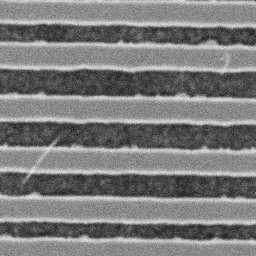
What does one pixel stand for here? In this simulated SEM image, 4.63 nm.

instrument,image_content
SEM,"lines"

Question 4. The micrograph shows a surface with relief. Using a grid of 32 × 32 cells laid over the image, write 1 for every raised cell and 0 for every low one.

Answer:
11111111111111111111111111111111
11111111111111111111111111111111
11111111111111111111111111111111
00000000000000000000000000000000
00000000000000000000000000000000
11111111111110000000000000000000
11111111111111111111111111111111
11111111111111111111111111111111
01111111110111111111111111111111
00000000000000000000000000000000
00000000000000000000000000000000
00000000000000000000000000000000
11111111111111111111111111111111
11111111111111111111111111111111
11111111111111111111111111111111
00000000000000000000000011111000
00000000000000000000000000000000
00000000000000000000000000000000
11111111100000000000000000000000
11111111111111111111111111111111
11111111111111111111111111111111
00111111111111111111111111111111
00000000000000000000000000000000
00000000000000000000000000000000
00000000000000000000000000000000
11111111111111111111111111111111
11111111111111111111111111111111
11111111111111111111111111111111
00000000000000000000000000000000
00000000000000000000000000000000
11111111111111111111111111111111
11111111111111111111111111111111